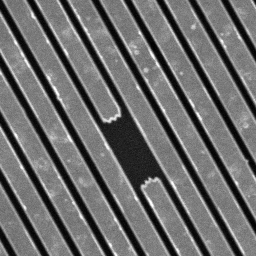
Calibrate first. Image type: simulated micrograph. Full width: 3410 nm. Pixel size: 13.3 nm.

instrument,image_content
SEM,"parallel lines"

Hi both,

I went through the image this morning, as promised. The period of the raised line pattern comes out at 375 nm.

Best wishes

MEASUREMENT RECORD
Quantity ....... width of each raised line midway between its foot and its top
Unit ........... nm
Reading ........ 273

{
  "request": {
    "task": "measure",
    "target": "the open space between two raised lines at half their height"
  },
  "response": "95.7 nm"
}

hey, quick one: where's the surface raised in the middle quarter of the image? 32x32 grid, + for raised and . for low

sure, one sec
..++++++..++++++..++++++..++++++
...+++++...+++++...++++++..+++++
+..++++++..++++++..++++++..+++++
++..+++++...++++++..++++++..++++
++..++++++..++++++...+++++..++++
+++..++++++..++++++..++++++..+++
+++..++++++...+++++...+++++...++
++++..++++++..++++++..++++++..++
++++..++++++...+++++...++++++..+
+++++..++++++..++++++..++++++..+
+++++...++++++..++++++..++++++..
++++++..++++++..++++++..++++++..
.++++++..+++++...++++++..++++++.
.++++++..++++....++++++...+++++.
..++++++..........++++++..++++++
...+++++...........+++++...+++++
+..++++++..........++++++..+++++
+...+++++...........+++++...++++
++..++++++..........++++++..++++
++...++++++..........++++++..+++
+++..++++++..........++++++...++
+++...++++++..........++++++..++
++++..++++++...........+++++...+
+++++..++++++..........++++++..+
+++++...+++++...........+++++...
++++++..++++++..........++++++..
.+++++...+++++...........++++++.
.++++++..++++++..........++++++.
..+++++...++++++..........++++++
..++++++..++++++....++++..++++++
...++++++..++++++...+++++..+++++
+..++++++...+++++...+++++...++++